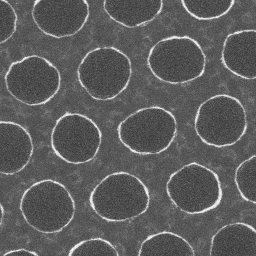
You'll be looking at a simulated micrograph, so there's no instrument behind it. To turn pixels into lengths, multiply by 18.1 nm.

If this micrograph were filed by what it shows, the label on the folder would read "a regular array of holes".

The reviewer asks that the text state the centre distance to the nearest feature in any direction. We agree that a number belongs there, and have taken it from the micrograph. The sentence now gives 1310 nm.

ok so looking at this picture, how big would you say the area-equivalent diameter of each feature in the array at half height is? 904 nanometres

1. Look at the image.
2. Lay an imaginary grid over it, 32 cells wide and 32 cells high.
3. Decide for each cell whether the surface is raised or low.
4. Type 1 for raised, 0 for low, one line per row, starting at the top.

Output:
01110000000110000000111000000111
00110000000110000000111100001111
00110000000111000001111111111111
00111000001111111111111111111111
01111110111111111111111111111000
11111111111111111111000011110000
11111111111100011110000001110000
11100011111000001110000000110000
10000001110000001110000001111000
10000001110000001111000001111100
10000001110000001111111111111111
10000001111000011111111111111111
11000011111111111111111111000011
11111111111111111111111110000011
11111111001111110000001110000001
00111110000011100000001100000001
00011110000011100000001110000011
00001110000001100000011110000011
00001110000011110000011111111111
00001111000011111111111111111111
00011111111111111111111111111100
00111111111111111111110000111100
11111111111110000111100000011100
11110000111100000011100000011100
11100000011100000011100000011100
11100000011100000011110000011111
11100000011100000011111001111111
11100000011111011111111111111111
11110000111111111111111111110001
11111111111111111110001111100000
11111111110000111100000111100000
11001111100000011100000011000000